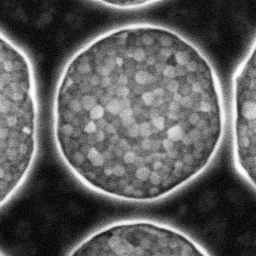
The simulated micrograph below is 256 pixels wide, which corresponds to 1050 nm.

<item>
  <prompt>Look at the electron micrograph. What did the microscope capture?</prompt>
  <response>holes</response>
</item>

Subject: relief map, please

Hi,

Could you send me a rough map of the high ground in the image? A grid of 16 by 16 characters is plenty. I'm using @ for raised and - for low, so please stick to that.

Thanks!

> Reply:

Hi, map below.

@@@@@@@@@@@@@@@@
@@@@@@@@@@@@@@@@
@@@@@@-----@@@@@
-@@@@--------@@@
--@@---------@@-
--@@----------@-
--@@----------@-
--@-----------@-
--@@----------@-
--@@---------@@-
--@@@--------@@-
-@@@@@-----@@@@@
@@@@@@@@@@@@@@@@
@@@@@@@@@@@@@@@@
@@@@@@-----@@@@@
@@@@@-------@@@@